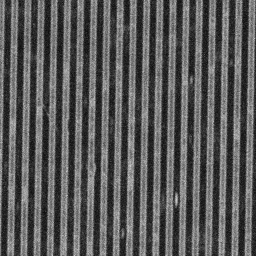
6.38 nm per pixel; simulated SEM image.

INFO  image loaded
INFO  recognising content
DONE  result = parallel lines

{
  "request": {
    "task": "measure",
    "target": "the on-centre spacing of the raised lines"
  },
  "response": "0.0841 um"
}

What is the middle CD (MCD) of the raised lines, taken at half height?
32.7 nm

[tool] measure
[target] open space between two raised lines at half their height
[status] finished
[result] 49.4 nanometres